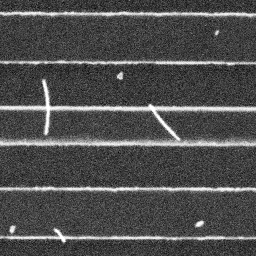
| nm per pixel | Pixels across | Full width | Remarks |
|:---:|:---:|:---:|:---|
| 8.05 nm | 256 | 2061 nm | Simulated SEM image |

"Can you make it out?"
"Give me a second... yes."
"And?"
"lines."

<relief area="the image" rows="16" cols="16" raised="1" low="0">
0000000000000000
1111111111111111
1111111111111111
1111111111111111
0000000000000000
0000000000000000
0000000000000000
1111111111111111
1111111111111111
0000000000000000
0000000000000000
0000000000000000
1111111111111111
1111111111111111
1111111111111111
0000000000000000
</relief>